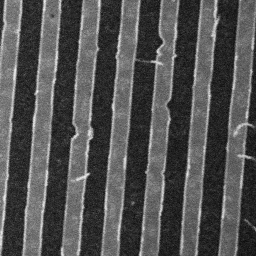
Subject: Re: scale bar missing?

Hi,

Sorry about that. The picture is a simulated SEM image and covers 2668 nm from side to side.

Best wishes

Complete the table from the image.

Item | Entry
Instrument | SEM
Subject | parallel lines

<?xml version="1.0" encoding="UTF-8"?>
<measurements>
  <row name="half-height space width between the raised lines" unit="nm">230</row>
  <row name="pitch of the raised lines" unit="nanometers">407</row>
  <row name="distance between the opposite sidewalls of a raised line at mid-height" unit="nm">182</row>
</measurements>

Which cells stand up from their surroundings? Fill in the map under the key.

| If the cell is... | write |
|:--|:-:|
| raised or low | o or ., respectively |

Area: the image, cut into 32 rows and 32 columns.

.oo..ooo..oo...oo...oo...oo...oo
.oo..ooo..oo...oo...oo...oo...oo
oo...oo...oo...oo...oo...oo...oo
oo...oo...oo...oo...oo...oo...oo
oo...oo...oo...oo...oo...oo...oo
oo...oo...oo...oo...oo...oo..ooo
oo...oo...oo...oo...oo...oo..ooo
oo...oo...oo...oo..ooo...oo..ooo
oo...oo...oo...oo..ooo..ooo..ooo
oo...oo..ooo...oo..ooo..oo...oo.
oo...oo..ooo..oo...oo...oo...oo.
oo...oo..ooo..oo...oo...oo...oo.
oo..ooo..oo...oo...oo...oo...oo.
oo..ooo..oo...oo...oo...oo...oo.
o...oo...oo...oo...oo...oo...oo.
o...oo...oo...oo...oo...oo...oo.
o...oo....oo..oo...oo...oo...oo.
o...oo...oo...oo...oo...oo..ooo.
o...oo...oo...oo...oo...oo..ooo.
o...oo...oo...oo...oo...oo..ooo.
o...oo...oo...oo...oo..oo...oo..
o...oo...oo..ooo..ooo..oo...oo..
o...oo...oo..ooo..ooo..oo...oo..
o..ooo..ooo..ooo..oo...oo...oo..
o..ooo..oo...oo...oo...oo...oo..
o..ooo..oo...oo...oo...oo...oo..
o..oo...oo...oo...oo...oo...oo..
...oo...oo...oo...oo...oo...oo..
...oo...oo...oo...oo...oo...oo..
...oo...oo...oo...oo...oo...oo..
...oo...oo...oo...oo...oo..ooo..
...oo...oo...oo..ooo...oo..ooo..